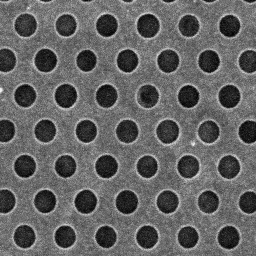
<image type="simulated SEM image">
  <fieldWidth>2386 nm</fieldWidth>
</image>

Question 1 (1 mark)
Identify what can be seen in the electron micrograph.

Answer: a regular array of holes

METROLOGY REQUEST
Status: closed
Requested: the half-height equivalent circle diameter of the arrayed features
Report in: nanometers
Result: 216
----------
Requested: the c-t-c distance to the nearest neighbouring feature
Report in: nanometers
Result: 376